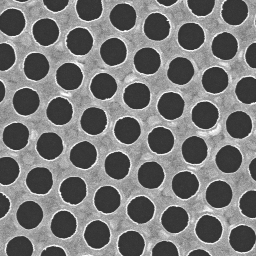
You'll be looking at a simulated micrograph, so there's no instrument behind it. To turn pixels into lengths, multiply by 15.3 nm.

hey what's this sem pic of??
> a regular array of holes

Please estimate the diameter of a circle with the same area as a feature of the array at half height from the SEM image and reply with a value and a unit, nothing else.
418 nanometres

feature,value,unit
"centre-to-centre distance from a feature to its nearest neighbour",0.535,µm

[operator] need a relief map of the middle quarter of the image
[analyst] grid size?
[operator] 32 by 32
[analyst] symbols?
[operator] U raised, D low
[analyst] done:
DDDUUUUUUUUUDUUUUUDDDDDDUUDDDDDD
DDDDUUUUUUUUUUUUUUDDDDDDUUDDDDDD
DDDDDUUUDDDUUUUUUUUUDDUUUUDDDDDD
DDDDDUUDDDDDDUUUUUUUUUUUUUDDDDDD
DDDDUUUDDDDDDUUUUUUUUUUUUUUDDDDU
DDDDUUUDDDDDDUUUDDDDDUUUUUUUUUUU
UDUUUUUDDDDDDUUDDDDDDUUUUUUUUUUU
UUUUUUUDDDDDDUUDDDDDDDUUUDDDDUUU
UUUUUUUUDDDDUUUDDDDDDDUUDDDDDDUU
DUUUUUUUUUUUUUUDDDDDDUUDDDDDDDUU
DDUUUUUUUUUUUUUUDDDDDUUDDDDDDDUU
DDUUUDDDDDUUUUUUUUUUUUUUDDDDDDUU
DDUUUDDDDDUUUUUUUUUUUUUUDDDDDDUU
DDUUDDDDDDDUUUUDDUUUUUUUUDDDUUUU
DUUUDDDDDDDUUDDDDDDUUUUUUUUUUUUU
UUUUDDDDDDDUUDDDDDDUUUUUUUUUUUUU
UUUUUDDDDDUUDDDDDDDUUUDDDDUUUUUU
UUUUUUDDDUUUUDDDDDDUUDDDDDDUUUUU
UUUUUUUUUUUUUDDDDDDUUDDDDDDDUUUD
UUUUDDUUUUUUUUDDDDUUUDDDDDDDUUDD
UUDDDDDDUUUUUUUUUUUUUDDDDDDUUDDD
UUDDDDDDUUUUUUUUUUUUUUDDDDDUUDDD
UDDDDDDDUUUDDDDUUUUUUUUDDUUUUUDD
UDDDDDDDUUUDDDDDUUUUUUUUUUUUUUDD
UUDDDDDDUUDDDDDDDUUUDDDUUUUUUUUD
UUUDDDDUUUDDDDDDDUUDDDDDUUUUUUUU
UUUUUUUUUUDDDDDDUUUDDDDDDUUUUUUU
UUUUUUUUUUUDDDDDUUDDDDDDDUUUDDDD
UDDDUUUUUUUUDDDUUUDDDDDDDUUDDDDD
DDDDDUUUUUUUUUUUUUUDDDDDDUUDDDDD
DDDDDDUUUUUDUUUUUUUUDDDDUUUDDDDD
DDDDDDUUDDDDDUUUUUUUUUUUUUUDDDDD